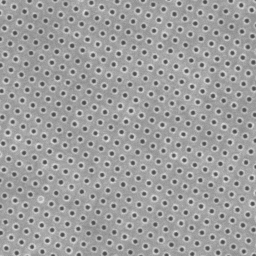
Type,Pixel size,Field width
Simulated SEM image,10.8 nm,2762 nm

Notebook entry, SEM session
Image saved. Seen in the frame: a regular array of holes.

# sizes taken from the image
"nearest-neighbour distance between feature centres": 122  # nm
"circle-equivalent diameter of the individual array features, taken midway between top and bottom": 51.7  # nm